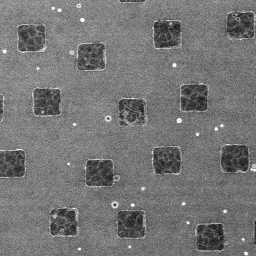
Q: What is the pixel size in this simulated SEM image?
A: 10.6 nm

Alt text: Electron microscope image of a regular array of raised bodies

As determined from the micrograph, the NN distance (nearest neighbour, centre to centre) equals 692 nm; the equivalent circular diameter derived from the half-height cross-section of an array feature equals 31.1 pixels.